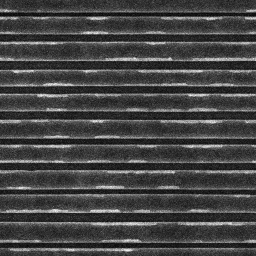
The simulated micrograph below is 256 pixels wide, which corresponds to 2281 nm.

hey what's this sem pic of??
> parallel lines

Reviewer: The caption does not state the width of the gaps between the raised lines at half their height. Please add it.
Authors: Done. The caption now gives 73.5 nm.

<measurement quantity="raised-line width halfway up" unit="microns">0.155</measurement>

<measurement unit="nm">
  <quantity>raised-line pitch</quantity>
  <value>230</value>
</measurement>